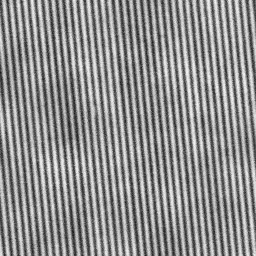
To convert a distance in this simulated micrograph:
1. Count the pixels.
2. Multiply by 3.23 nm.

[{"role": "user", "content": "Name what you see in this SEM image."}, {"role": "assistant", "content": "parallel lines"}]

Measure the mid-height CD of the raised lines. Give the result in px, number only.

3.47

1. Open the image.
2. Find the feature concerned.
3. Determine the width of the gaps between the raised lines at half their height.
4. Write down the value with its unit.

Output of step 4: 3.47 pixels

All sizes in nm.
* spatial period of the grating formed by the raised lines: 22.7